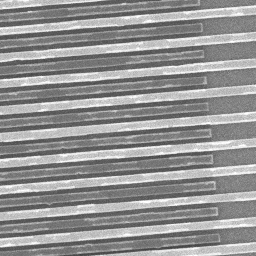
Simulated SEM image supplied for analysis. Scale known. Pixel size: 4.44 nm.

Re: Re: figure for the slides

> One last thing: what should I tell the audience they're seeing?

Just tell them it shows parallel lines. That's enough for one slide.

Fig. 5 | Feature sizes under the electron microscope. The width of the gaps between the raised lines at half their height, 22.1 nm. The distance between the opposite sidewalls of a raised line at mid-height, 8.36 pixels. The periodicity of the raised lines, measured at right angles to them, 0.0585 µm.